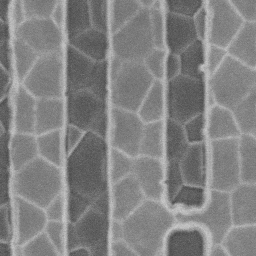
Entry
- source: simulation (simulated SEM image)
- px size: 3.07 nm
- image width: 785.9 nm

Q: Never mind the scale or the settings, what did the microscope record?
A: one or a few lines or trenches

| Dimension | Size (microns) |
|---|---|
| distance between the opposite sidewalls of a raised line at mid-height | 0.164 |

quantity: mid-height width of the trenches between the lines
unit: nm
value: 135